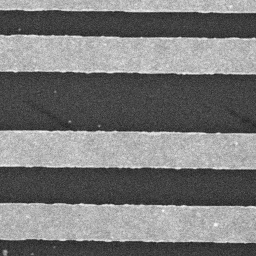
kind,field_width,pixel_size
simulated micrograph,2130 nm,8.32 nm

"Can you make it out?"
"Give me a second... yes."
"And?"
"lines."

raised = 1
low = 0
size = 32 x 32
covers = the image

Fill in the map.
11111111111111111111111111111111
00000000000000000000000011111111
00000000000000000000000000000000
00000000000000000000000000000000
11111100100000000000000000000000
11111111111111111111111111111111
11111111111111111111111111111111
11111111111111111111111111111111
11111111111111111111111111111111
00000000000000000000000000000000
00000000000000000000000000000000
00000000000000000000000000000000
00000000000000000000000000000000
00000000000000000000000000000000
00000000000000000000000000000000
00000000000000000000000000000000
11111111111010100000000000000000
11111111111111111111111111111111
11111111111111111111111111111111
11111111111111111111111111111111
11111111111111111111111111111111
00000000000000000000000000000000
00000000000000000000000000000000
00000000000000000000000000000000
00000000000000000000000000000000
00000000000000000000000000000000
11111111111111111111111111111111
11111111111111111111111111111111
11111111111111111111111111111111
11111111111111111111111111111111
00000000000000000000000000000000
00000000000000000000000000000000